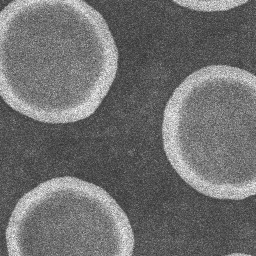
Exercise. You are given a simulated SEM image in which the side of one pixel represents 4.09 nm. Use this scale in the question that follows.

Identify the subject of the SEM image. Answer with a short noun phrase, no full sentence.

raised bodies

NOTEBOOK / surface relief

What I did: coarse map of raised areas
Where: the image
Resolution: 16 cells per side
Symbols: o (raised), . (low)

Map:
.oooo...........
oooooo..........
ooooooo.........
ooooooo.........
ooooooo......oo.
oooooo......oooo
.ooooo.....ooooo
...........ooooo
..........oooooo
...........ooooo
...........ooooo
...oo.......oooo
..ooooo.........
.ooooooo........
.ooooooo........
.ooooooo........